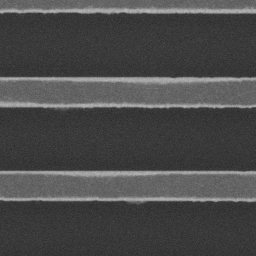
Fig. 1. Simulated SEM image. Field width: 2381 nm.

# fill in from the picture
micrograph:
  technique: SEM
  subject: lines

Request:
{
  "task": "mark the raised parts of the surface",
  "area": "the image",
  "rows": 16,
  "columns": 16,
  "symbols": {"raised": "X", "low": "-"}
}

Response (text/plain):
XXXXXXXXXXXXXXXX
----------------
----------------
----------------
----------------
XXXXXXXXXXXXXXXX
XXXXXXXXXXXXXXXX
----------------
----------------
----------------
----------------
XXXXXXXXXXXXXXXX
XXXXXXXXXXXXXXXX
----------------
----------------
----------------